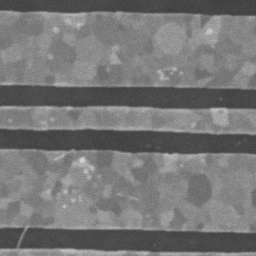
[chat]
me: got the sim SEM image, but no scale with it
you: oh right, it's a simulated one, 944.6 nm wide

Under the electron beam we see lines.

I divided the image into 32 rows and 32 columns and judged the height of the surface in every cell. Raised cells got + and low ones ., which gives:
................................
++..............................
++++++++++++++++++++++++++++++++
++++++++++++++++++++++++++++++++
++++++++++++++++++++++++++++++++
++++++++++++++++++++++++++++++++
++++++++++++++++++++++++++++++++
++++++++++++++++++++++++++++++++
++++++++++++++++++++++++++++++++
++++++++++++++++++++++++++++++++
.+++++++++++++++++++++++++++++++
................................
................................
+++++++++++++++++...............
++++++++++++++++++++++++++++++++
++++++++++++++++++++++++++++++++
........................++++++++
................................
................................
++++++++++++++++++++++++++++++++
++++++++++++++++++++++++++++++++
++++++++++++++++++++++++++++++++
++++++++++++++++++++++++++++++++
++++++++++++++++++++++++++++++++
++++++++++++++++++++++++++++++++
++++++++++++++++++++++++++++++++
++++++++++++++++++++++++++++++++
++++++++++++++++++++++++++++++++
........+++.+.++++++++++++++++++
................................
................................
+++++++++++++...................